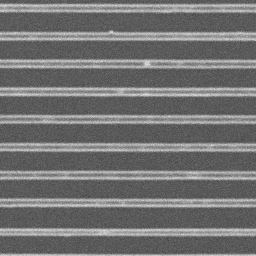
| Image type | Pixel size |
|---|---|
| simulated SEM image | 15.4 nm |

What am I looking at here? parallel lines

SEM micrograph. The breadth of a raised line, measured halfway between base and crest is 106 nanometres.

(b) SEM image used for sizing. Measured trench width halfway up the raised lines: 316 nm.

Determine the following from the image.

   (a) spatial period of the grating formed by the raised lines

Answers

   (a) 431 nanometers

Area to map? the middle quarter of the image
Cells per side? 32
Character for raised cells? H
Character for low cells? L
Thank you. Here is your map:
HHHHHHHHHHHHHHHHHHHHHHHHHHHHHHHH
LLLLLLLLLLLLLLLLLLLLLLLLLLLLLLLL
LLLLLLLLLLLLLLLLLLLLLLLLLLLLLLLL
LLLLLLLLLLLLLLLLLLLLLLLLLLLLLLLL
LLLLLLLLLLLLLLLLLLLLLLLLLLLLLLLL
LLLLLLLLLLLLLLLLLLLLLLLLLLLLLLLL
HHHHHHHHHHHHHHHHHHHHHHHHHHHHHHHH
HHHHHHHHHHHHHHHHHHHHHHHHHHHHHHHH
LLLLLLLLLLLLLLLLLLLLLLLLLLLLLLLL
LLLLLLLLLLLLLLLLLLLLLLLLLLLLLLLL
LLLLLLLLLLLLLLLLLLLLLLLLLLLLLLLL
LLLLLLLLLLLLLLLLLLLLLLLLLLLLLLLL
LLLLLLLLLLLLLLLLLLLLLLLLLLLLLLLL
HHHHHHHHHHHHHHHHHHHHHHHHHHHHHHHH
HHHHHHHHHHHHHHHHHHHHHHHHHHHHHHHH
LLLLLLLLLLLLLLLLLLLLLLLLLLLLLLLL
LLLLLLLLLLLLLLLLLLLLLLLLLLLLLLLL
LLLLLLLLLLLLLLLLLLLLLLLLLLLLLLLL
LLLLLLLLLLLLLLLLLLLLLLLLLLLLLLLL
LLLLLLLLLLLLLLLLLLLLLLLLLLLLLLLL
HHHHHHHHHHHHHHHHHHHHHHHHHHHHHHHH
HHHHHHHHHHHHHHHHHHHHHHHHHHHHHHHH
LLLLLLLLLLLLLLLLLLLLLLLLLLLLLLLL
LLLLLLLLLLLLLLLLLLLLLLLLLLLLLLLL
LLLLLLLLLLLLLLLLLLLLLLLLLLLLLLLL
LLLLLLLLLLLLLLLLLLLLLLLLLLLLLLLL
LLLLLLLLLLLLLLLLLLLLLLLLLLLLLLLL
HHHHHHHHHHHHHHHHHHHHHHHHHHHHHHHH
HHHHHHHHHHHHHHHHHHHHHHHHHHHHHHHH
LLLLLLLLLLLLLLLLLLLLLLLLLLLLLLLL
LLLLLLLLLLLLLLLLLLLLLLLLLLLLLLLL
LLLLLLLLLLLLLLLLLLLLLLLLLLLLLLLL